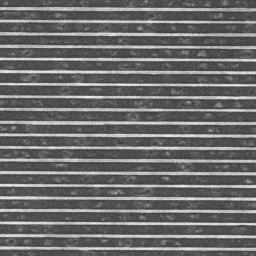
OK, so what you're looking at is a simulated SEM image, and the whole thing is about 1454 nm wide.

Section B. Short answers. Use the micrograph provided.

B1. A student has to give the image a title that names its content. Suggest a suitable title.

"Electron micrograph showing parallel lines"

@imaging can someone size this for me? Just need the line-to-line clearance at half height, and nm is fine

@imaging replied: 59.7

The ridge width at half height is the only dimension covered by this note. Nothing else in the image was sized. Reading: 10.7 nm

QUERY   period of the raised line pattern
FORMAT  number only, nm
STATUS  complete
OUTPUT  71.7